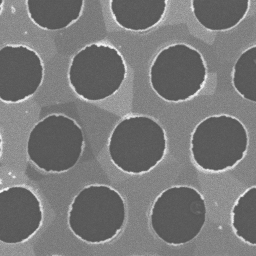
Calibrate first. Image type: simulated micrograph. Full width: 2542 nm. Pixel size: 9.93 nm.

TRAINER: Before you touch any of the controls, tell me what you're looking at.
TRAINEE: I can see holes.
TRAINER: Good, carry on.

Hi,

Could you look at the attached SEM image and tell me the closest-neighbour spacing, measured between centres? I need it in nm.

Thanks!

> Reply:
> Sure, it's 802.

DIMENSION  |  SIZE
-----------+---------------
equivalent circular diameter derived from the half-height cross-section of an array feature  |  548 nanometers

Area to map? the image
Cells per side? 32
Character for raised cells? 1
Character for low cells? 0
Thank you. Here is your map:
11100000001111000000011100000001
11110000001111000000111100000001
11110000011111100000111110000011
11111100111111110001111111000111
11111111111111111111111111111111
11111111111111111111111111111111
00001111110000011111000001111110
00000111100000011110000001111100
00000111100000001110000000111000
00000111100000011110000000111000
00000111100000011110000001111000
00001111110000111111000001111100
10011111111111111111100111111110
11111111111111111111111111111111
11111111111111111111111111101111
11111000011111100000111110000011
11110000001111000000111100000001
11110000001111000000011100000001
11100000001111000000011100000001
11110000001111000000111100000011
11111000011111100001111110000111
11111111111111110011111111111111
11111111111111111111111111111111
10011111111000111111110011111111
00001111110000011111000001111100
00000111100000011110000000111100
00000111100000001110000000111000
00000111100000011110000000111000
00000111100000011110000001111000
00001111110000111111000011111100
11111111111111111111111111111111
11111111111111111111111111111111